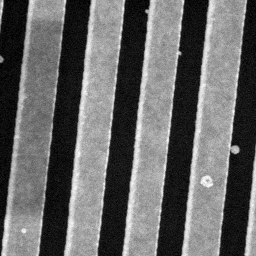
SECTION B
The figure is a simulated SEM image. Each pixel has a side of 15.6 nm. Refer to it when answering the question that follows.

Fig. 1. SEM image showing lines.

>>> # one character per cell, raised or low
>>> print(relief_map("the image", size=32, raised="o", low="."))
....oooo...ooooo...oooo...ooooo.
....oooo...oooo....oooo...ooooo.
...ooooo...oooo....oooo...ooooo.
...ooooo...oooo....oooo...oooo..
...ooooo...oooo...oooo....oooo..
...ooooo...oooo...oooo....oooo..
...ooooo...oooo...oooo....oooo..
...oooo....oooo...oooo...ooooo..
...oooo....oooo...oooo...ooooo..
...oooo...ooooo...oooo...ooooo..
...oooo...oooo....oooo...ooooo..
..ooooo...oooo....oooo...oooo...
..ooooo...oooo...ooooo...oooo...
..ooooo...oooo...ooooo...oooo...
..ooooo...oooo...oooo....oooo...
..ooooo...oooo...oooo....oooo...
..ooooo...oooo...oooo...ooooo...
..oooo....oooo...oooo...ooooo...
..oooo....oooo...oooo...ooooo...
..oooo...ooooo...oooo...ooooo...
.ooooo...oooo....oooo...ooooo...
.ooooo...oooo....oooo...oooo....
.ooooo...oooo...ooooo...oooo....
.ooooo...oooo...oooo....oooo....
.ooooo...oooo...oooo....oooo...o
.ooooo...oooo...oooo....oooo...o
.oooo....oooo...oooo...ooooo...o
.oooo....oooo...oooo...ooooo...o
.oooo....ooo....oooo...ooooo...o
ooooo...oooo....oooo...ooooo...o
ooooo...oooo....oooo...oooo....o
ooooo...oooo...oooo....oooo....o